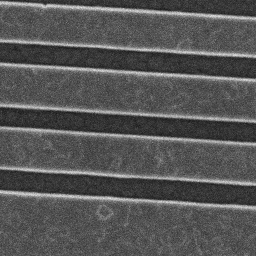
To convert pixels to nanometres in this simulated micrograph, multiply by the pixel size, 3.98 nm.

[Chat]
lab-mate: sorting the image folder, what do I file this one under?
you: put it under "one or a few lines or trenches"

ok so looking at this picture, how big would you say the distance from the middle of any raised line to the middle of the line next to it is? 251 nm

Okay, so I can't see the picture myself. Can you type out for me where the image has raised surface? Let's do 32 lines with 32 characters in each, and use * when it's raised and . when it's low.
***.............................
********************............
********************************
********************************
********************************
.....***************************
.....................***********
................................
********........................
************************........
********************************
********************************
********************************
....****************************
....................************
................................
********........................
************************........
********************************
********************************
********************************
......**************************
.......................*********
................................
********........................
************************........
********************************
********************************
********************************
********************************
********************************
********************************